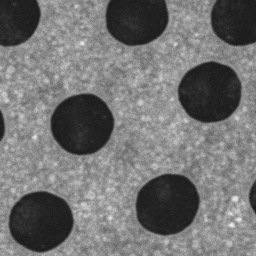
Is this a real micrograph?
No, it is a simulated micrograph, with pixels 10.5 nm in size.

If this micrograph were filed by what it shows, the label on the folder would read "holes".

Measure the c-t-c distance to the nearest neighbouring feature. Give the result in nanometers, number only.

1170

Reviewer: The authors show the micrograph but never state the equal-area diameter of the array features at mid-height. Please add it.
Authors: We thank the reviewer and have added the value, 658 nm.